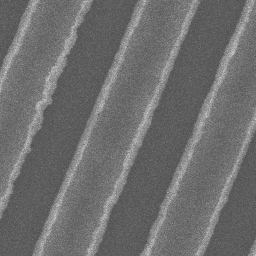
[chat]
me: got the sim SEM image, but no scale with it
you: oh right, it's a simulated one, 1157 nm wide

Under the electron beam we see one or a few lines or trenches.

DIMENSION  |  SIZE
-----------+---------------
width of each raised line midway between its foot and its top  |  232 nm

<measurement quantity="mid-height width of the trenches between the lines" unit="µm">0.223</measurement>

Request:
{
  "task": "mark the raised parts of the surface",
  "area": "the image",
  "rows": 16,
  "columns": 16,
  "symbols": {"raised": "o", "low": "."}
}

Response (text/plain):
..ooo....ooo...o
.oooo...oooo...o
.oooo...ooo....o
.ooo...oooo...oo
oooo...ooo....oo
ooo....ooo...ooo
ooo...oooo...ooo
oo....ooo....ooo
oo...oooo...oooo
oo...ooo....ooo.
o....ooo...oooo.
o...oooo...ooo..
....ooo...oooo..
...oooo...ooo...
...ooo....ooo...
..oooo...oooo...